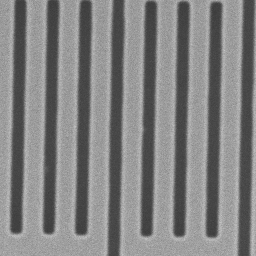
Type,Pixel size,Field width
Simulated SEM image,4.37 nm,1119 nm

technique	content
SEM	groups of lines, slits or small figures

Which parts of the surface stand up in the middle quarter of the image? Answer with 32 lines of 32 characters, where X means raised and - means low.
XXX----XXXXX---XXXXX---XXXXX---X
XXX----XXXXX---XXXXX---XXXXX---X
XXX----XXXXX---XXXXX---XXXXX---X
XXX----XXXXX---XXXXX---XXXXX---X
XXX----XXXX----XXXXX---XXXXX---X
XXX----XXXX----XXXXX---XXXXX---X
XXX----XXXX----XXXXX---XXXXX---X
XXX----XXXX----XXXXX---XXXXX---X
XXX----XXXX----XXXXX---XXXXX---X
XXX----XXXX----XXXXX---XXXXX---X
XXX----XXXX----XXXXX---XXXXX---X
XXX----XXXX----XXXXX---XXXXX---X
XXX----XXXX----XXXXX---XXXXX---X
XXX----XXXX----XXXXX---XXXXX---X
XXX----XXXX----XXXXX---XXXXX---X
XXX----XXXX----XXXXX---XXXXX---X
XXX----XXXX----XXXXX---XXXXX---X
XXX----XXXX----XXXXX---XXXXX---X
XXX----XXXX----XXXX----XXXX----X
XXX----XXXX----XXXX----XXXX----X
XXX----XXXX----XXXX----XXXX----X
XXX----XXXX----XXXX----XXXX----X
XXX----XXXX----XXXX----XXXX----X
XXX----XXXX----XXXX----XXXX----X
XXX----XXXX----XXXX----XXXX----X
XXX---XXXXX----XXXX----XXXX----X
XXX---XXXXX----XXXX----XXXX----X
XXX---XXXXX---XXXXX----XXXX----X
XXX---XXXXX---XXXXX----XXXX----X
XXX---XXXXX---XXXXX----XXXX----X
XXX---XXXXX---XXXXX----XXXX----X
XXX---XXXXX---XXXXX----XXXX----X